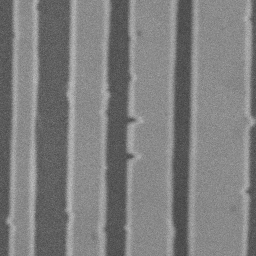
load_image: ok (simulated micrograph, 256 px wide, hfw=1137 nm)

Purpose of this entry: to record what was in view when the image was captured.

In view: one or a few lines or trenches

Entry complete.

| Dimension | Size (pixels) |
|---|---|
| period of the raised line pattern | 65.5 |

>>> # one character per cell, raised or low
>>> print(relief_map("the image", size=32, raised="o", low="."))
..oo.....oooo...oooooo..ooooooo.
..oo.....oooo...oooooo..ooooooo.
..oo.....oooo...oooooo..ooooooo.
..oo.....oooo...oooooo..ooooooo.
..oo.....oooo....ooooo..ooooooo.
..oo.....oooo....ooooo..ooooooo.
..ooo....oooo...oooooo..ooooooo.
..ooo....oooo...oooooo..ooooooo.
..ooo....oooo...oooooo..ooooooo.
..ooo....oooo....oooo...ooooooo.
..oo.....oooo...ooooo...ooooooo.
..oo.....oooo...ooooo...ooooooo.
..oo.....oooo...ooooo...ooooooo.
..oo.....oooo...ooooo...ooooooo.
..oo.....oooo....oooo...ooooooo.
..oo.....oooo....oooo...ooooooo.
..oo.....oooo...ooooo...ooooooo.
..oo.....oooo...ooooo...ooooooo.
..oo.....oooo...ooooo...ooooooo.
..oo.....oooo....oooo...ooooooo.
..oo.....oooo...ooooo...ooooooo.
..oo.....oooo...ooooo...ooooooo.
..oo.....oooo...ooooo...ooooooo.
..oo.....oooo...ooooo...ooooooo.
..oo.....oooo...ooooo...ooooooo.
..oo.....oooo...ooooo...ooooooo.
.ooo.....oooo...ooooo...ooooooo.
.ooo.....oooo...ooooo...ooooooo.
..oo.....oooo...ooooo...ooooooo.
.ooo.....oooo...ooooo...ooooooo.
.ooo.....oooo...ooooo...ooooooo.
.ooo.....oooo...ooooo...ooooooo.